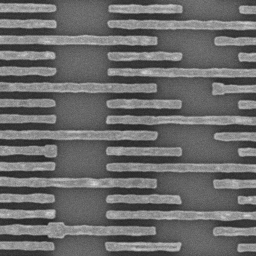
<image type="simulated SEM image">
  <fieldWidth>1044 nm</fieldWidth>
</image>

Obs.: wiring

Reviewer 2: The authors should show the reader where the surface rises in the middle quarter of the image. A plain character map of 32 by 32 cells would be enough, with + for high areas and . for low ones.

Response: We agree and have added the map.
................................
...........+++++++++++++++++++++
...........+++++++++++++++++++++
................................
................................
+++++++++++++++++++++++.........
+++++++++++++++++++++++.........
................................
................................
...........++++++++++++++++++...
...........++++++++++++++++++...
................................
................................
...........+++++++++++++++++++++
...........+++++++++++++++++++++
................................
................................
+++++++++++++++++++++++.........
+++++++++++++++++++++++.........
................................
................................
...........++++++++++++++++++...
...........++++++++++++++++++...
................................
................................
...........+++++++++++++++++++++
...........+++++++++++++++++++++
................................
................................
+++++++++++++++++++++++.........
+++++++++++++++++++++++.........
................................